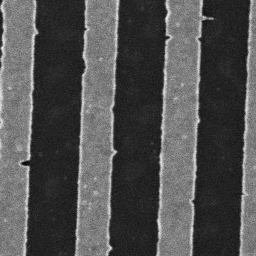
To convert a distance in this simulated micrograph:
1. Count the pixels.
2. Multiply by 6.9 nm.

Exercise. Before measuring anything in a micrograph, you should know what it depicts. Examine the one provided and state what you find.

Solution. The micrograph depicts one or a few lines or trenches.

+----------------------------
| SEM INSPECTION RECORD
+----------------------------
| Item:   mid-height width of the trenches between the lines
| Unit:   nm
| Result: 343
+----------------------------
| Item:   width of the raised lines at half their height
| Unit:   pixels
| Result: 32.5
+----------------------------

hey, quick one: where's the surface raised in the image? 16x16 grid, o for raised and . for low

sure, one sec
oo...oo...ooo...
oo...oo...ooo...
oo...oo...oo....
oo...oo...oo....
oo...oo...oo...o
oo...oo...oo...o
oo...oo...oo...o
oo...oo...oo...o
oo...oo...oo...o
oo...oo...oo...o
oo...oo...oo...o
oo...oo...oo...o
oo...oo...oo...o
oo...oo...oo...o
oo...oo...oo...o
oo...oo...oo...o